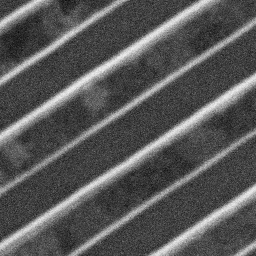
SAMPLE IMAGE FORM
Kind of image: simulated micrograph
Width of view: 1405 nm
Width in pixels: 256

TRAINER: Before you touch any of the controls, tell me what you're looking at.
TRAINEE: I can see lines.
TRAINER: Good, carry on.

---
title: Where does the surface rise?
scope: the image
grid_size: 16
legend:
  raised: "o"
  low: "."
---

..ooooo.....oooo
ooooo......ooooo
oooo.....ooooo..
oo......ooooo...
o.....ooooo.....
.....ooooo.....o
...ooooo.....ooo
..ooooo.....oooo
ooooo.....oooooo
oooo.....ooooo..
oo.....oooooo...
o.....ooooo.....
....oooooo.....o
...ooooo.....ooo
.oooooo.....oooo
ooooo.....oooooo